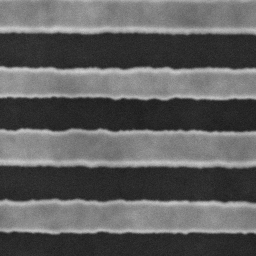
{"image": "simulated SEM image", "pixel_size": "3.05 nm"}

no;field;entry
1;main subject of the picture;lines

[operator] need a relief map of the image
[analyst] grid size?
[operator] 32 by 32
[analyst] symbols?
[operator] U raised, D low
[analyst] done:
UUUUUUUUUUUUUUUUUUUUUUUUUUUUUUUU
UUUUUUUUUUUUUUUUUUUUUUUUUUUUUUUU
UUUUUUUUUUUUUUUUUUUUUUUUUUUUUUUU
UUUUUUUUUUUUUUUUUUUUUUUUUUUUUUUU
DDDDDDDDDDDDDDDDDDDDDDDDDDDDDDDD
DDDDDDDDDDDDDDDDDDDDDDDDDDDDDDDD
DDDDDDDDDDDDDDDDDDDDDDDDDDDDDDDD
DDDDDDDDDDDDDDDDDDDDDDDDDDDDDDDD
UDUUDDUDDDDDDDDDDUUDDDDDDDDDDDDD
UUUUUUUUUUUUUUUUUUUUUUUUUUUUUUUU
UUUUUUUUUUUUUUUUUUUUUUUUUUUUUUUU
UUUUUUUUUUUUUUUUUUUUUUUUUUUUUUUU
DDDDDDDDDDDDDDDDDDDDDDDDDDDDDDDD
DDDDDDDDDDDDDDDDDDDDDDDDDDDDDDDD
DDDDDDDDDDDDDDDDDDDDDDDDDDDDDDDD
DDDDDDDDDDDDDDDDDDDDDDDDDDDDDDDD
UUUUUUUUUUUUUUUUUUUUUUUUUUUUDDDU
UUUUUUUUUUUUUUUUUUUUUUUUUUUUUUUU
UUUUUUUUUUUUUUUUUUUUUUUUUUUUUUUU
UUUUUUUUUUUUUUUUUUUUUUUUUUUUUUUU
UUUUUUUUUUUUUUUUUUUUUUUUUUUUUUUU
DDDDDDDDDDDDDDDDDDDDDDDDDDDDDDDD
DDDDDDDDDDDDDDDDDDDDDDDDDDDDDDDD
DDDDDDDDDDDDDDDDDDDDDDDDDDDDDDDD
DDDDDDDDDDDDDDDDDDDDDDDDDDDDDDDD
UUUUUUUUUUUUUUUUUUUUUUUUUUUUUUUU
UUUUUUUUUUUUUUUUUUUUUUUUUUUUUUUU
UUUUUUUUUUUUUUUUUUUUUUUUUUUUUUUU
UUUUUUUUUUUUUUUUUUUUUUUUUUUUUUUU
DDDDDDDDDDDDDDDDDDDDDDDDDDDDDDDD
DDDDDDDDDDDDDDDDDDDDDDDDDDDDDDDD
DDDDDDDDDDDDDDDDDDDDDDDDDDDDDDDD